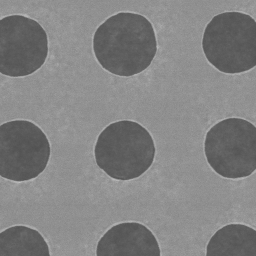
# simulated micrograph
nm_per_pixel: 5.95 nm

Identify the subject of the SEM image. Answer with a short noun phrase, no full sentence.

holes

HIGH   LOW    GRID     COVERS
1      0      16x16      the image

1111111111111111
0011110001111000
0001110000111000
0001110000111000
0011111001111101
1111111111111111
1111111111111111
1111111111111101
0001110001111000
0001110000111000
0001110001111000
1111111111111111
1111111111111111
1111111111111111
0011111001111100
0001110000111000